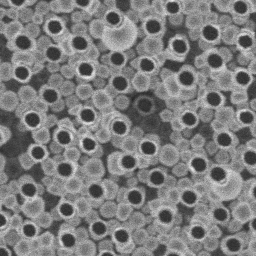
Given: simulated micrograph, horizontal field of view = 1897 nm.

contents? a regular array of holes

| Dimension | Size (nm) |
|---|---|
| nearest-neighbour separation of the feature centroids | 212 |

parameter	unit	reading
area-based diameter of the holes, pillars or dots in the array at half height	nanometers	107